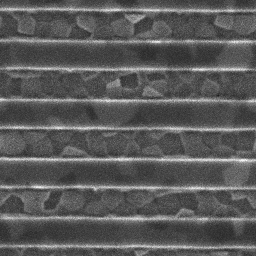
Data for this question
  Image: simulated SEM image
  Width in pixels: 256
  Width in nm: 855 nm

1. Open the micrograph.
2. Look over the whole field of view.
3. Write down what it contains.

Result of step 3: parallel lines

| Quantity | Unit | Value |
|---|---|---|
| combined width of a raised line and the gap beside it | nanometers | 198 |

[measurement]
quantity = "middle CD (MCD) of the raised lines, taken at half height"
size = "95.2 nanometers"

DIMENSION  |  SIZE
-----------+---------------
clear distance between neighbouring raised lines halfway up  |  0.101 µm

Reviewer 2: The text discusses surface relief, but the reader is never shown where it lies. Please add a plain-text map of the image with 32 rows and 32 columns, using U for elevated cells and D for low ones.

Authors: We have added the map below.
UUUUUUUUUUUUUUUUUUUUUUUUUUUUUUUU
DDDDDDDDDDDDDDDDDDDDDDDDDDDDDDDD
DDDDDDDDDDDDDDDDDDDDDDDDDDDDDDDD
DDDDDDDDDDDDDDDDDDDDDDDDDDDDDDDD
DDDDDDDDDDDDDDDDDDDDDDDDDDDDDDDD
UUUUUUUUUUUUUUUUUUUUUUUUUUUUUUUU
UUUUUUUUUUUUUUUUUUUUUUUUUUUUUUUU
UUUUUUUUUUUUUUUUUUUUUUUUUUUUUUUU
UUUUUUUUUUUUUUUUUUUUUUUUUUUUUUUU
DDDDDDDDDDDDDDDDDDDDDDDDDDDDDDDD
DDDDDDDDDDDDDDDDDDDDDDDDDDDDDDDD
DDDDDDDDDDDDDDDDDDDDDDDDDDDDDDDD
UUUUUDUDUUUDDDDDDDDDDDDDDDDDDDDD
UUUUUUUUUUUUUUUUUUUUUUUUUUUUUUUU
UUUUUUUUUUUUUUUUUUUUUUUUUUUUUUUU
UUUUUUUUUUUUUUUUUUUUUUUUUUUUUUUU
DDDDDDDDDDDDDDDDDDDDDDDDDDDDDDDD
DUDDDDDDDDDDDDDDDDDDDDDDDDDDDDDD
DUDDDDDDDDDDDDDDDDDDDDDDDDDDDDDD
DDDDDDDDDDDDDDDDDDDDDDDDDDDDDDDD
UUUUUUUUUUUUUUUUUUUUUUUUUUUUUUUU
UUUUUUUUUUUUUUUUUUUUUUUUUUUUUUUU
UUUUUUUUUUUUUUUUUUUUUUUUUUUUUUUU
DDDDDDDDDDDDDDDDDDDDDDDDDUUUUUUU
DDDDDDDDDDDDDDDDDDDDDDDDDDDDDDDD
DDDDDDDDDDDDDDDDDDDDDDDDDDDDDDDD
DDDDDDDDDDDDDDDDDDDDDDDDDDDDDDDD
UUUUUUUUUUUUUUUUUUUUUUUUUUUUUUUU
UUUUUUUUUUUUUUUUUUUUUUUUUUUUUUUU
UUUUUUUUUUUUUUUUUUUUUUUUUUUUUUUU
UUUUUUUUUUUUUUUUUUUUUUUUUUUUUUUU
DDDDDDDDDDDDDDDDDDDDDDDDDDDDDDDD